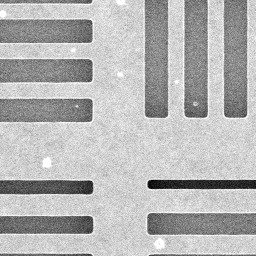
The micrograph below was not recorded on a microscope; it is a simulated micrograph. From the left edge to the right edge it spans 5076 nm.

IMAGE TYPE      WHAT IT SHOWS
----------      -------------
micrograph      groups of lines, slits or small figures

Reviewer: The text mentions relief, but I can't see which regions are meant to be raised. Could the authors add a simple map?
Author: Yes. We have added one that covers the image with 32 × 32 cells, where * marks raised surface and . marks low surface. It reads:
******************...**...**...*
******************...**...**...*
...........*******...**...**...*
............******...**...**...*
............******...**...**...*
******************...**...**...*
******************...**...**...*
...........*******...**...**...*
............******...**...**...*
............******...**...**...*
******************...**...**...*
******************...**...**...*
...........*******...**...**...*
............******...**...**...*
............******...**...**...*
********************************
********************************
********************************
********************************
********************************
********************************
********************************
.........**********.............
............*******.............
********************************
********************************
********************************
............******..............
............******..............
********************************
********************************
********************************